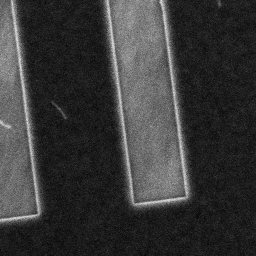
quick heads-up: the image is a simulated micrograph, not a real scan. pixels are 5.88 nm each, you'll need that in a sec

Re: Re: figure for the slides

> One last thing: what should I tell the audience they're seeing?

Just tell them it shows one or a few lines or trenches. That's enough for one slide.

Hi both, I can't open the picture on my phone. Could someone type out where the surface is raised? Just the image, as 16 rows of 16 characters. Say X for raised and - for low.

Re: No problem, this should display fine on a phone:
-XXXXXX---XXXXXX
-XXXXXX---XXXXXX
-XXXXXX---XXXXXX
-XXXXXX----XXXXX
-XXXXXX----XXXXX
-XXXXXX----XXXXX
--XXXXXX---XXXXX
--XXXXXX---XXXXX
--XXXXXX---XXXXX
--XXXXXX---XXXXX
--XXXXXX---XXXXX
--XXXXXX----XXXX
--XXXXXXX--XXXXX
--XXXXXXXXXXXXXX
XXXXXXXXXXXXXXXX
XXXXXXXXXXXXXXXX